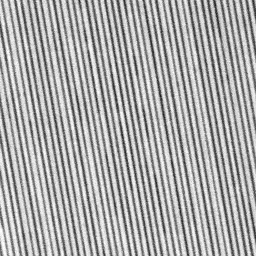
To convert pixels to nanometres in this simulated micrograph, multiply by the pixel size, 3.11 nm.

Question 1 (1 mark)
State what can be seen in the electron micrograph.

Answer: parallel lines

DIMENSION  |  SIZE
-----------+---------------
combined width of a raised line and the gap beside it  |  19.7 nanometers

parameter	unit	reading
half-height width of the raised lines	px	3.05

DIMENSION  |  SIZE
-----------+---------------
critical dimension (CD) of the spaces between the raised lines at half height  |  9.1 nanometers